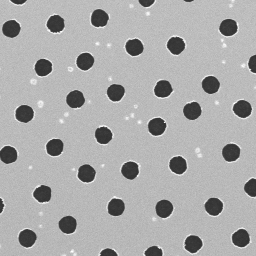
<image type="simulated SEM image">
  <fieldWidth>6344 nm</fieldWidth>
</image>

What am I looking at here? a regular array of holes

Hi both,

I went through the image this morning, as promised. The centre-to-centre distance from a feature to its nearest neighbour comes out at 1.03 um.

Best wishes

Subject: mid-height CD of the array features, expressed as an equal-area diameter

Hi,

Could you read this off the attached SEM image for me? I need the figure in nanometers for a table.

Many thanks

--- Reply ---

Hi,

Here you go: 446